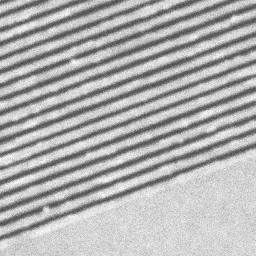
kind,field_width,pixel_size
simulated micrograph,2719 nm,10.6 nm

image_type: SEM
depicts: parallel lines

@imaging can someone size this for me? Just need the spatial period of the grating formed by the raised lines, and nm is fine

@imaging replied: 138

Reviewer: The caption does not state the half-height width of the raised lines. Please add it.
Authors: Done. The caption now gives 0.0724 microns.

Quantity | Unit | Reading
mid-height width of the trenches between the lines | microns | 0.0724